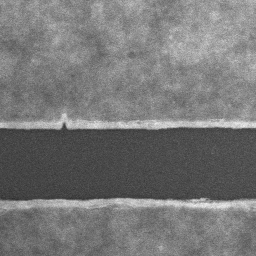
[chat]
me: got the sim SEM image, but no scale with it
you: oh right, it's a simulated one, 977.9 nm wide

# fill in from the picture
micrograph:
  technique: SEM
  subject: one or a few lines or trenches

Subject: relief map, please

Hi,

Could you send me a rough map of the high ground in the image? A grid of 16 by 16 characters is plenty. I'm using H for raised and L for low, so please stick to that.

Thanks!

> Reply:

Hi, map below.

HHHHHHHHHHHHHHHH
HHHHHHHHHHHHHHHH
HHHHHHHHHHHHHHHH
HHHHHHHHHHHHHHHH
HHHHHHHHHHHHHHHH
HHHHHHHHHHHHHHHH
HHHHHHHHHHHHHHHH
HHHHHHHHHHHHHHHH
LLLLLLLLLLLLLLLL
LLLLLLLLLLLLLLLL
LLLLLLLLLLLLLLLL
LLLLLLLLLLLLLLLL
LLLLLLLLLLLLLLLL
HHHHHHHHHHHHHHHH
HHHHHHHHHHHHHHHH
HHHHHHHHHHHHHHHH